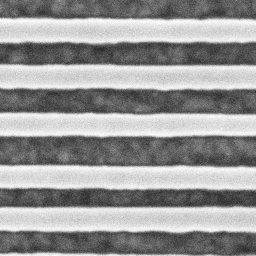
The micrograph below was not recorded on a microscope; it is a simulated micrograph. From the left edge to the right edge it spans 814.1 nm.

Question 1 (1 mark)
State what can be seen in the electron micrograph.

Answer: lines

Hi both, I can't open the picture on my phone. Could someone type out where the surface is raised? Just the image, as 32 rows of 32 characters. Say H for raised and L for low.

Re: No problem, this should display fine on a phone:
LLLLLLLLLLLLLLLLLLLLLLLLLLLLLLLL
LLLLLLLLLLLLLLLLLLLLLLLLLLLLLLLL
HHHHHHHHHHHHHHHHHHHHHHHHHHHHHHHH
HHHHHHHHHHHHHHHHHHHHHHHHHHHHHHHH
HHHHHHHHHHHHHHHHHHHHHHHHHHHHHHHH
LLLLLLLLLLLLLLLLLLLLLLLLLLLLLLLL
LLLLLLLLLLLLLLLLLLLLLLLLLLLLLLLL
LLLLLLLLLLLLLLLLLLLLLLLLLLLLLLLL
HHHHHHHHHHHHHHHHHHHHHHHHHHHHHHHH
HHHHHHHHHHHHHHHHHHHHHHHHHHHHHHHH
HHHHHHHHHHHHHHHHHHHHHHHHHHHHHHHH
LLLLLLLLLLLLLLLLLLLLLLLLLLLLLLLL
LLLLLLLLLLLLLLLLLLLLLLLLLLLLLLLL
LLLLLLLLLLLLLLLLLLLLLLLLLLLLLLLL
HHHHHHHHHHHHHHHHHHHHHHHHHHHHHHHH
HHHHHHHHHHHHHHHHHHHHHHHHHHHHHHHH
HHHHHHHHHHHHHHHHHHHHHHHHHHHHHHHH
LLLLLLLLLLLLLLLLLLLLLLLLLLLLLLLL
LLLLLLLLLLLLLLLLLLLLLLLLLLLLLLLL
LLLLLLLLLLLLLLLLLLLLLLLLLLLLLLLL
LLLLLLLLLLLLLLLLLLLLLLLLLLLLLLLL
HHHHHHHHHHHHHHHHHHHHHHHHHHHHHHHH
HHHHHHHHHHHHHHHHHHHHHHHHHHHHHHHH
LHHHHLHHHHHLLHHHHHHHHHHHHHHHHHHH
LLLLLLLLLLLLLLLLLLLLLLLLLLLLLLLL
LLLLLLLLLLLLLLLLLLLLLLLLLLLLLLLL
HHHHHHHHHHHHHHHHHHHHHHHHHHHHHHHH
HHHHHHHHHHHHHHHHHHHHHHHHHHHHHHHH
HHHHHHHHHHHHHHHHHHHHHHHHHHHHHHHH
LLLLLLLLLLLLLLLLLLLLLLLLLLLLLLLL
LLLLLLLLLLLLLLLLLLLLLLLLLLLLLLLL
LLLLLLLLLLLLLLLLLLLLLLLLLLLLLLLL